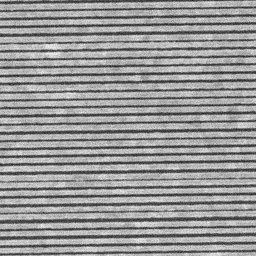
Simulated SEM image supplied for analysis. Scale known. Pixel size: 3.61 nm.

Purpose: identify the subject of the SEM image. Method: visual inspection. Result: parallel lines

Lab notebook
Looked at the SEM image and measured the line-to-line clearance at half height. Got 14 nanometres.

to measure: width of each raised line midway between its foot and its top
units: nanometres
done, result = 17.1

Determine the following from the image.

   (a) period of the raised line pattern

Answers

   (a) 29.2 nm